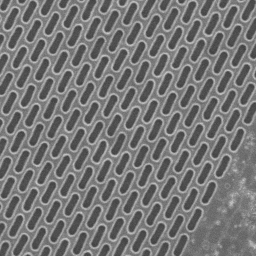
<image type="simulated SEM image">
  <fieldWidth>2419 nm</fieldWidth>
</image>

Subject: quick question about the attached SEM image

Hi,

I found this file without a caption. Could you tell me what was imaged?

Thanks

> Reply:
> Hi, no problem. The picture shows a regular array of holes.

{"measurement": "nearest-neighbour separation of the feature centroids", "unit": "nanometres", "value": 185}